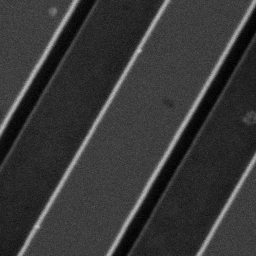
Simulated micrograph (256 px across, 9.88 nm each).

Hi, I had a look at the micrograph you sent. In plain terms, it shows lines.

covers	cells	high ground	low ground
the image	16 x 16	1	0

1111100000111111
1111000001111110
1110000001111110
1110000011111100
1100000011111100
1100000111111000
1000000111110000
1000001111110000
0000011111100000
0000011111100000
0000111111000001
0000111110000001
0001111110000011
0001111100000011
0011111100000111
0111111000000111